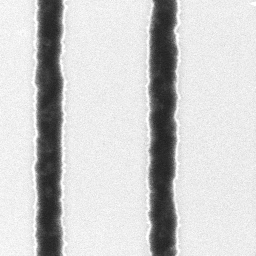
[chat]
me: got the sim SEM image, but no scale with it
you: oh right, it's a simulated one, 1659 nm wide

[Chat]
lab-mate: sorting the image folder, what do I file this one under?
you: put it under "one or a few lines or trenches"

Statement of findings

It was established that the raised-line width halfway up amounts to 0.192 um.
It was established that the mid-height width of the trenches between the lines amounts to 544 nm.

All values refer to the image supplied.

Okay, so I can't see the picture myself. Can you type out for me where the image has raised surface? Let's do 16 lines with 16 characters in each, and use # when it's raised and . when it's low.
..##.....##.....
..##.....##.....
..##.....##.....
..##.....##.....
..##.....##.....
..##.....##.....
..##.....##.....
..##.....##.....
..##.....##.....
..##.....##.....
..##.....##.....
..##.....##.....
..##.....##.....
..##.....##.....
..##.....##.....
..##.....##.....